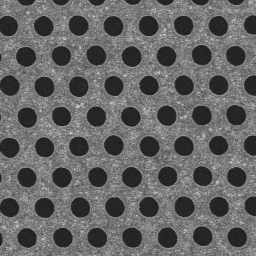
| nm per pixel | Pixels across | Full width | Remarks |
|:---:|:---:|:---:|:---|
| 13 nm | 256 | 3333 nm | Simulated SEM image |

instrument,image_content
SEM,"a regular array of holes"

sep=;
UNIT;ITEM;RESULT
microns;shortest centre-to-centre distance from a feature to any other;0.444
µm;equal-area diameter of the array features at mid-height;0.26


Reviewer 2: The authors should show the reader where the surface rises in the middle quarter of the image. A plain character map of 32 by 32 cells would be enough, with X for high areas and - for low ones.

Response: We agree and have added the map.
XXXXXXXXXXXXXXXX--XXXXXXX--XXXXX
XXXXXXXXXXXXXXXXXXXXXXXXXXXXXXXX
XXXXXXXXXXXXXXXXXXXXXXXXXXXXXXXX
XX---XXXXXX---XXXXXX---XXXXX----
X-----XXXX-----XXXX-----XXXX----
X-----XXXX-----XXXX-----XXXX----
X-----XXXX-----XXXX-----XXXX----
XX---XXXXXX---XXXXXX---XXXXXX--X
XXXXXXXXXXXXXXXXXXXXXXXXXXXXXXXX
XXXXXXXXXXXXXXXXXXXXXXXXXXXXXXXX
XXXXXXXXXXXXXXXXXXXXXXXXX--XXXXX
-XXXXX----XXXXX---XXXXXX----XXXX
--XXXX----XXXX-----XXXX-----XXXX
--XXXX-----XXX-----XXXX-----XXXX
--XXXX----XXXXX----XXXXX----XXXX
XXXXXXX--XXXXXXX-XXXXXXXXXXXXXXX
XXXXXXXXXXXXXXXXXXXXXXXXXXXXXXXX
XXXXXXXXXXXXXXXXXXXXXXXXXXXXXXXX
XX---XXXXXX---XXXXXX---XXXXX---X
X-----XXXX-----XXXX-----XXXX----
X-----XXXX-----XXXX-----XXX-----
X-----XXXX-----XXXX-----XXXX----
XX---XXXXXX---XXXXXX---XXXXX----
XXXXXXXXXXXXXXXXXXXXXXXXXXXXXXXX
XXXXXXXXXXXXXXXXXXXXXXXXXXXXXXXX
XXXXXXXXXXXXXXXXXXXXXXXXXXXXXXXX
-XXXXXX---XXXXX----XXXXX----XXXX
--XXXX-----XXXX----XXXX-----XXXX
--XXXX-----XXX------XXX-----XXXX
--XXXX-----XXXX----XXXXX----XXXX
-XXXXXX---XXXXXX---XXXXXX--XXXXX
XXXXXXXXXXXXXXXXXXXXXXXXXXXXXXXX